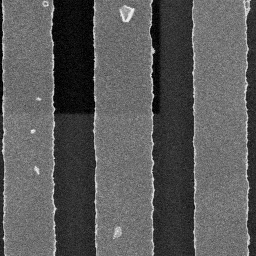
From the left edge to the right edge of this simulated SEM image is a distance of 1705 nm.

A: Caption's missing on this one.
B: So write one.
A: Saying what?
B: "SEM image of lines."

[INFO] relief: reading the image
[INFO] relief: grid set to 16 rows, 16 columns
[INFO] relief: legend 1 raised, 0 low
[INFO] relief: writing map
1110001110001110
1110001110001110
1110001110001110
1110001111001110
1110001111001110
1110001111001110
1110001111001110
1110001111001110
1110001111001110
1110001111001110
1110001111001110
1110001111001111
1110001111001111
1110001111001110
1110001111001111
1110001111001111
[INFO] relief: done